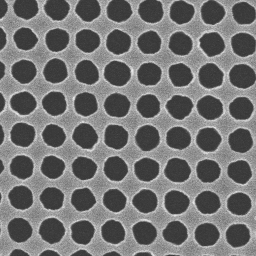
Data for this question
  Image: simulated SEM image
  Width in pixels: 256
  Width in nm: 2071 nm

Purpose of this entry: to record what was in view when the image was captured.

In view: a regular array of holes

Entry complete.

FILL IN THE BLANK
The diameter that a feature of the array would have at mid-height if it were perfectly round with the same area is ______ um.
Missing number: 0.196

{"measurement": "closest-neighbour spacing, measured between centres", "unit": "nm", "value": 250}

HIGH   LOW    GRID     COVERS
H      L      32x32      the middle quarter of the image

LHHLLLLLHHHLLLLLHHHLLLLLHHLLLLLH
LHHLLLLLLHLLLLLLHHHLLLLLHHLLLLLL
LHHLLLLLLHLLLLLLLHLLLLLLHHLLLLLL
HHHLLLLLLHLLLLLLLHLLLLLLHHLLLLLL
HHHHLLLLHHHLLLLLHHHLLLLHHHHLLLLL
HHHHHHHHHHHHHLLHHHHHHHHHHHHHLLHH
HHHHHHHHHHHHHHHHHHHHHHHHHHHHHHHH
HHHHLLLHHHHHLLHHHHHHHLHHHHHHHHHH
HHHLLLLLHHHLLLLLHHHLLLLHHHHLLLLH
LHHLLLLLHHLLLLLLHHLLLLLLHHLLLLLL
LHHLLLLLLHLLLLLLLHLLLLLLHLLLLLLL
HHHLLLLLHHLLLLLLHHLLLLLLHHLLLLLL
HHHHLLLHHHHLLLLLHHHLLLLHHHHLLLLH
HHHHHHHHHHHHHLHHHHHHHLHHHHHLLLHH
HHHHHHHHHHHHHHHHHHHHHHHHHHHHHHHH
HHHLLLLHHHHLLLHHHHHHLLHHHHHHHHHH
HHHLLLLLHHLLLLLLHHLLLLLHHHLLLLHH
HHLLLLLLHHLLLLLLHHLLLLLLHHLLLLLH
LHLLLLLLLHLLLLLLHHLLLLLLHHLLLLLL
HHHLLLLLHHLLLLLLHHLLLLLLHLLLLLLL
HHHHLLLHHHHLLLLHHHHLLLLHHHLLLLLH
HHHHHHHHHHHHHHHHHHHLLLHHHHHHHHHH
HHHHHHHHHHHHHHHHHHHHHHHHHHHHHHHH
HHHLLLHHHHHLLLHHHHHHHHHHHHHLLHHH
HHLLLLLLHHLLLLLHHHLLLLLHHHLLLLLH
HHLLLLLLHHLLLLLLHHLLLLLLHHLLLLLH
HHLLLLLLHHLLLLLLHHLLLLLLHLLLLLLL
HHLLLLLLHHLLLLLLHHLLLLLLHLLLLLLL
HHHHLLLHHHHLLLLHHHLLLLLHHHLLLLLH
HHHHHHHHHHHHHHHHHHHHLHHHHHHHLLHH
HHHHHHHHHHHHHHHHHHHHHHHHHHHHHHHH
HHHLLLHHHHHLLLHHHHHHLHHHHHHLHHHH